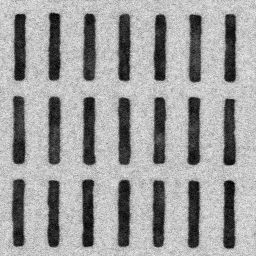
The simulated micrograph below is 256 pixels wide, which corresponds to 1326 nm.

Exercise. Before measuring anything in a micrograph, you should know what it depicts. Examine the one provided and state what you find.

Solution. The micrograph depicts a regular array of holes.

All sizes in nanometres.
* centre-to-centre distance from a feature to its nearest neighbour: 181